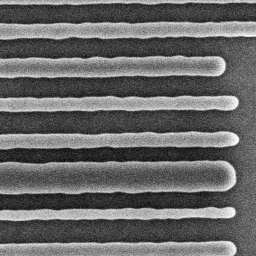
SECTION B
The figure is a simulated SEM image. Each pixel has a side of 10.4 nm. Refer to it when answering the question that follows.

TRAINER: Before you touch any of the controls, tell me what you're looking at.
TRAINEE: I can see groups of lines, slits or small figures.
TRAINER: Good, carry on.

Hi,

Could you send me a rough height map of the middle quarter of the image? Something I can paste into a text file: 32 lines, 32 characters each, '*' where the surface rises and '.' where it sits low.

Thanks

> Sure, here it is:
********************************
********************************
********************************
................................
................................
................................
................................
................................
..........***....*.....***..****
********************************
********************************
......**........................
................................
................................
................................
................................
................................
..............**********.*******
********************************
********************************
**********.********.*****...****
................................
................................
................................
.............................**.
********************************
********************************
********************************
********************************
********************************
********************************
********************************